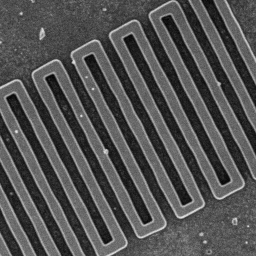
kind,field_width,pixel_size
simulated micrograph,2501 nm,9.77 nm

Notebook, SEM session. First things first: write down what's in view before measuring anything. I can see groups of lines, slits or small figures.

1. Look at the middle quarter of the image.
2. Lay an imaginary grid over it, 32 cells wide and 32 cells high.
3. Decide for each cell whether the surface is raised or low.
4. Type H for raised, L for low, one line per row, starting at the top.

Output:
LLLHHHLLLHHHLLLHHHLLLHHHLLLHHHLL
LLLHHHLLLHHHLLLLHHHLLLHHHLLLHHHL
HLLLHHHLLLHHHLLLHHHLLLHHHLLLHHHL
HLLLHHHLLLHHHLLLHHHHLLLHHHLLLHHH
HHLLLHHHLLLHHHLLLHHHLLLHHHLLLHHH
HHLLLHHHLLLHHHHLLLHHHLLLHHHLLLHH
HHHLLLHHHLLLHHHLLLHHHLLLHHHLLLHH
HHHLLLHHHLLLLHHLLLLHHHLLLHHHLLLH
LHHHLLLHHHLLLHHHLLLHHHLLLHHHLLLH
LHHHLLLHHHLLLLHHLLLHHHHLLLHHHLLL
LLHHHLLLHHHLLLHHHLLLHHHLLLHHHLLL
LLHHHLLLHHHLLLHHHHLLLHHHLLLHHHLL
LLLHHHLLLHHHLLLHHHLLLHHHLLLHHHLL
LLLHHHLLLHHHLLLHHHHLLLHHHLLLHHHL
HLLLHHHLLLHHHLLLHHHLLLHHHLLLHHHL
HLLLHHHLLLHHHHLLHHHHLLLHHHLLLHHH
HHLLLHHHLLLHHHLLLHHHLLLHHHLLLHHH
HHLLLHHHLLLHHHLLLLHHHLLLHHHLLLHH
HHHLLLHHHLLLHHHLLLHHHLLLHHHLLLHH
HHHLLLHHHLLLHHHLLLLHHHLLLHHHLLLH
LHHHLLLHHHLLLHHHLLLHHHLLLHHHLLLH
LHHHLLLHHHHLLHHHLLLLHHHLLLHHHLLL
LLHHHLLLHHHLLLHHHLLLHHHLLLHHHLLL
LLHHHLLLHHHLLLHHHLLLLHHLLLLHHHLL
LLLHHHLLLHHHLLLHHHLLLHHHLLLHHHLL
LLLHHHLLLHHHLLLHHHHLLLHHHLLLHHHL
HLLLHHHLLLHHHLLLHHHLLLHHHLLLHHHL
HLLLHHHLLLHHHLLLHHHLLLLHHHLLLHHH
HHLLLHHHLLLHHHLLLHHHLLLHHHLLLHHH
HHLLLHHHLLLHHHLLLLHHLLLHHHHLLLHH
HHHLLLHHHLLLHHHLLLHHHLLLHHHLLLHH
HHHLLLHHHLLLHHHLLLLHHLLLLHHHLLLH